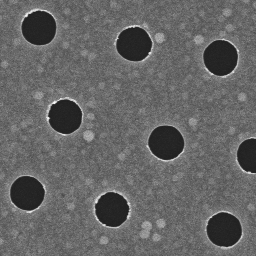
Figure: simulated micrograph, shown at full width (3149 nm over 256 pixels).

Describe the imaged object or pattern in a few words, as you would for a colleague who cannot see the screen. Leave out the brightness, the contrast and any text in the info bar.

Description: a regular array of holes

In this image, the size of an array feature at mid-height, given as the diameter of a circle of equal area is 34.8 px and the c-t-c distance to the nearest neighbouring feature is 1070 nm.